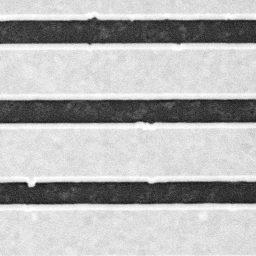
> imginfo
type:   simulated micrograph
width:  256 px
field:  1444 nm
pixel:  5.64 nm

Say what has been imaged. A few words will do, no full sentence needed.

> one or a few lines or trenches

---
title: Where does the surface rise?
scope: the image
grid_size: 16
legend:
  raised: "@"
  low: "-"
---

@@@@@@@@@@@@@@@@
----------------
----------------
@@@@@@@@@@@@@@@@
@@@@@@@@@@@@@@@@
@@@@@@@@@@@@@@@@
----------------
----------------
@@@@@@@@@@@@@@@@
@@@@@@@@@@@@@@@@
@@@@@@@@@@@@@@@@
----------------
----------------
@@@@@@@@@@@@@@@@
@@@@@@@@@@@@@@@@
@@@@@@@@@@@@@@@@